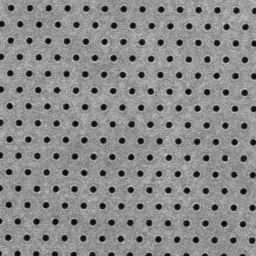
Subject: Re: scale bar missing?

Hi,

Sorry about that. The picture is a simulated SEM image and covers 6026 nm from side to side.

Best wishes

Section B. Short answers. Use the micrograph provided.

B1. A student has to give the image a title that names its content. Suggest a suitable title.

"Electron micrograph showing a regular array of holes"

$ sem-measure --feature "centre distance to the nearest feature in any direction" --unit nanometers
437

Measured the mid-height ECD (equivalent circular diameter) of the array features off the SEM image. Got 168 nm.